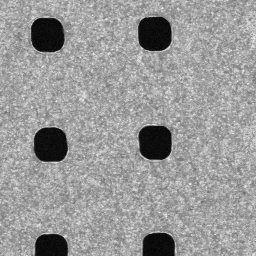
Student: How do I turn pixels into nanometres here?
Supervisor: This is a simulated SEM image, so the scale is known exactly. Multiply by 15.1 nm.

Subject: holes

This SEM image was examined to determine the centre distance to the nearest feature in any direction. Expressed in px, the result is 106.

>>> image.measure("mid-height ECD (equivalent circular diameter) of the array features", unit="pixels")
36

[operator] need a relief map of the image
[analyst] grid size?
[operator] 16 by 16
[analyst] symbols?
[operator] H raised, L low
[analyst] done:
HHHHHHHHHHHHHHHH
HHLLHHHHHLLHHHHH
HHLLHHHHHLLHHHHH
HHHHHHHHHHHHHHHH
HHHHHHHHHHHHHHHH
HHHHHHHHHHHHHHHH
HHHHHHHHHHHHHHHH
HHHHHHHHHHHHHHHH
HHLLHHHHHLLHHHHH
HHLLHHHHHLLHHHHH
HHHHHHHHHHHHHHHH
HHHHHHHHHHHHHHHH
HHHHHHHHHHHHHHHH
HHHHHHHHHHHHHHHH
HHHHHHHHHHHHHHHH
HHLLHHHHHLLHHHHH